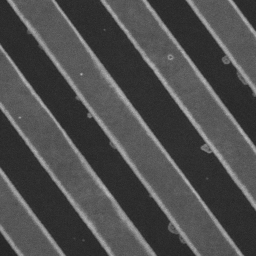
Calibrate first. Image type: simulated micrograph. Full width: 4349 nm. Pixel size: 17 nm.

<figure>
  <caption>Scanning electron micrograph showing lines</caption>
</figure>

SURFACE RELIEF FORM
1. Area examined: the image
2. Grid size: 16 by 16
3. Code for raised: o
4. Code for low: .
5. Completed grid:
.ooo...ooo..ooo.
..ooo..ooo...ooo
..ooo...ooo..ooo
o..ooo...ooo..oo
o...ooo...ooo..o
oo..ooo...ooo...
ooo..ooo...ooo..
.ooo..ooo...ooo.
.ooo...ooo...oo.
..ooo..ooo...ooo
...ooo..ooo...oo
o...oo...ooo...o
oo..ooo...ooo...
oo...ooo..ooo...
ooo...ooo..ooo..
.ooo..ooo...ooo.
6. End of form